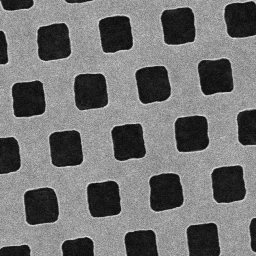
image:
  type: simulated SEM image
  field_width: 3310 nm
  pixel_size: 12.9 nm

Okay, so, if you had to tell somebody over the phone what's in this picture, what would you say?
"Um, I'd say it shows a regular array of holes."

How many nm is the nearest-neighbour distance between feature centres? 803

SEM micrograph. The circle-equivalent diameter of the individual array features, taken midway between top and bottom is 482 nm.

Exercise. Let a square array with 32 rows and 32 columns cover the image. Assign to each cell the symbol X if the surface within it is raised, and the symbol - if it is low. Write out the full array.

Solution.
----XXXXXXXXXXXXXXXXXXXXXXXXX---
XXXXXXXXXXXXXXXXXXXX----XXXX----
XXXXXXXXXXXXX---XXXX----XXXX----
XXXXX---XXXX----XXXX----XXXX----
-XXXX----XXXX----XXX----XXXXX--X
-XXXX----XXXX----XXXX--XXXXXXXXX
-XXXX----XXXX--XXXXXXXXXXXXXXXXX
-XXXX--XXXXXXXXXXXXXXXXXXXX-XXXX
XXXXXXXXXXXXXXXXXX---XXXX----XXX
XXXXXXXXXX---XXXX----XXXX----XXX
XX---XXXX----XXXX----XXXX----XXX
X----XXXX----XXXX----XXXX----XXX
XX----XXX----XXXXX---XXXXXXXXXXX
XX----XXXX---XXXXXXXXXXXXXXXXXXX
XX--XXXXXXXXXXXXXXXXXXXX-XXXXX--
XXXXXXXXXXXXXXXX-XXXXX----XXXX--
XXXXXXX---XXXX----XXXX----XXXX--
--XXXX----XXXX----XXXX----XXXX--
--XXXX----XXXX----XXXX----XXXXXX
---XXX----XXXX----XXXXXXXXXXXXXX
---XXXX---XXXXXXXXXXXXXXXXXXXXXX
--XXXXXXXXXXXXXXXXXXXXXXXXX---XX
XXXXXXXXXXXXXXXXXXX---XXXX-----X
XXXXX-XXXXX----XXXX----XXXX----X
XXX----XXXX----XXXX----XXXX----X
XXX----XXXX----XXXX----XXXXXXXXX
XXX----XXXX----XXXXXXXXXXXXXXXXX
XXX----XXXXXXXXXXXXXXXXXXXXXXXXX
XXXXXXXXXXXXXXXXXXXXXXXX---XXXX-
XXXXXXXXXXXXXXXX---XXXX----XXXX-
XXXXXXXX----XXXX----XXX----XXXX-
----XXXX----XXXX----XXXX----XXXX